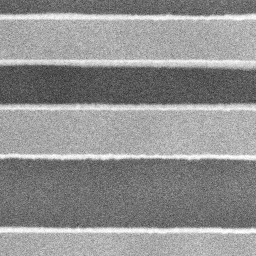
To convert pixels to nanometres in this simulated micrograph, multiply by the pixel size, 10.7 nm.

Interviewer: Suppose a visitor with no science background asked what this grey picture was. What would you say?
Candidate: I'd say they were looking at lines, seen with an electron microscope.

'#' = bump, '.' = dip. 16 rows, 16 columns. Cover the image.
................
################
################
################
................
................
................
################
################
################
................
................
................
................
#########.####..
################